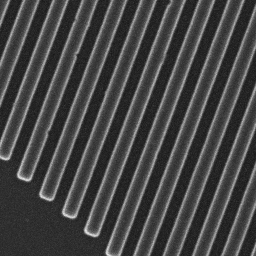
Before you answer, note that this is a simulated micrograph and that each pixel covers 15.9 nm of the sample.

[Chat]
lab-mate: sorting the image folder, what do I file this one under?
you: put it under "parallel lines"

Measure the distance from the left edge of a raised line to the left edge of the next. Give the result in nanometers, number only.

435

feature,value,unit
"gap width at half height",214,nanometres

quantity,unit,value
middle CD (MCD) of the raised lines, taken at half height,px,14.3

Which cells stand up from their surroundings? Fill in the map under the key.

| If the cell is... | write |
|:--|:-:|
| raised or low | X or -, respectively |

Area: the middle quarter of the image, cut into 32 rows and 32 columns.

XX----XXXX---XXXX---XXXX----XXX-
XX---XXXX----XXX----XXXX----XXX-
X----XXXX---XXXX----XXXX---XXXX-
X----XXX----XXXX---XXXX----XXX--
X---XXXX----XXX----XXXX---XXXX--
----XXXX---XXXX----XXX----XXXX--
----XXX----XXXX---XXXX----XXX---
---XXXX----XXX----XXXX---XXXX---
---XXXX---XXXX---XXXX----XXX----
--XXXX----XXX----XXXX----XXX----
--XXXX----XXX----XXX----XXXX---X
--XXXX---XXXX---XXXX----XXX----X
-XXXX----XXX----XXXX---XXXX----X
-XXXX---XXXX----XXX----XXXX---XX
-XXX----XXXX---XXXX----XXX----XX
XXXX----XXX----XXXX---XXXX----XX
XXXX---XXXX----XXX----XXXX---XXX
XXX----XXXX---XXXX----XXX----XXX
XXX----XXX----XXX----XXXX---XXXX
XXX---XXXX---XXXX----XXX----XXXX
XX----XXX----XXXX---XXXX----XXX-
XX---XXXX----XXX----XXXX---XXXX-
X----XXXX---XXXX----XXX----XXXX-
X----XXX----XXXX---XXXX----XXX--
X---XXXX----XXX----XXXX---XXXX--
----XXXX---XXXX----XXX----XXXX--
----XXX----XXXX---XXXX---XXXX---
---XXXX---XXXX----XXX----XXXX---
---XXXX---XXXX----XXX----XXXX---
--XXXX----XXX----XXXX---XXXX----
--XXXX---XXXX----XXX----XXXX---X
--XXX----XXXX---XXXX----XXX----X